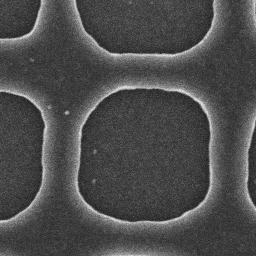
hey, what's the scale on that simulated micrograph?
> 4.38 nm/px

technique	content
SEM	holes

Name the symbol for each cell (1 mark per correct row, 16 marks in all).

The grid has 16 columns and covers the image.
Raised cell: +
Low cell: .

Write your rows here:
...++........+++
..+++........+++
++++++.......+++
++++++++++++++++
++++++++++++++++
++++++++++++++++
..++++......++++
...++........+++
...++........+++
...++........+++
...++........++.
...++........++.
..+++........+++
.++++++....+++++
++++++++++++++++
++++++++++++++++